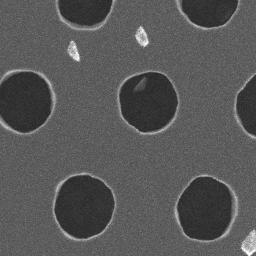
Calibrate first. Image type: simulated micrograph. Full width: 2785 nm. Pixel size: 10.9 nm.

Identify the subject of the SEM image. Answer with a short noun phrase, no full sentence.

holes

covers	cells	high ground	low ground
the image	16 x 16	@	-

@@@@---@@@@----@
@@@@--@@@@@@--@@
@@@@@@@@@@@@@@@@
@@@@@@@@@@@@@@@@
@-@@@@@@@@@@@@@@
---@@@@@---@@@@-
---@@@@@---@@@@-
---@@@@@---@@@@-
@@@@@@@@@@@@@@@@
@@@@@@@@@@@@@@@@
@@@@@@@@@@@@@@@@
@@@@---@@@@@--@@
@@@----@@@@----@
@@@----@@@@----@
@@@@--@@@@@@--@@
@@@@@@@@@@@@@@@@